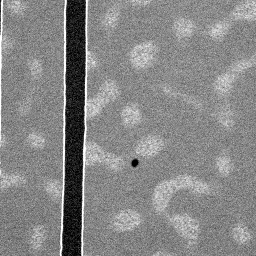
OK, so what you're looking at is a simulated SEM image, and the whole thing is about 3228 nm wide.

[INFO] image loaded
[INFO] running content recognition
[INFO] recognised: one or a few lines or trenches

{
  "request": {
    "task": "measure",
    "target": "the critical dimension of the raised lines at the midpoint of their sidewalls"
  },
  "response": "21 pixels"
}